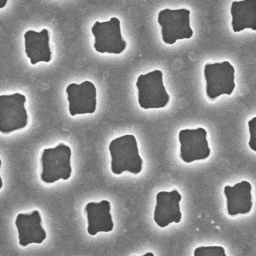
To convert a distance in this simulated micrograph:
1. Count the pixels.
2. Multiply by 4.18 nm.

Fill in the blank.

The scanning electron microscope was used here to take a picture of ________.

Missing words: a regular array of holes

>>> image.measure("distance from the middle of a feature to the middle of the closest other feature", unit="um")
0.282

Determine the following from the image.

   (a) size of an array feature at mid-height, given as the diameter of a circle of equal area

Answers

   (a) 142 nm